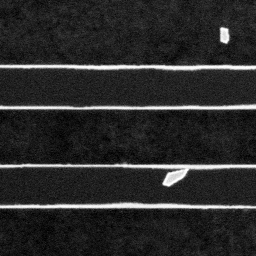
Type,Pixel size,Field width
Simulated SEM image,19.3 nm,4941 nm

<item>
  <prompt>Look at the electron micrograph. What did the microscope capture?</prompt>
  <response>lines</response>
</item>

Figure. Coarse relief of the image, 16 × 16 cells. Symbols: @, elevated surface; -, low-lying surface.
----------------
----------------
----------------
----------------
@@@@@@@@@@@@@@@@
@@@@@@@@@@@@@@@@
@@@@@@@@@@@@@@@@
----------------
----------------
----------------
@@@@@@@@@@@@@@@@
@@@@@@@@@@@@@@@@
@@@@@@@@@@@@@@@@
----------------
----------------
----------------